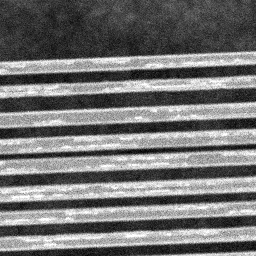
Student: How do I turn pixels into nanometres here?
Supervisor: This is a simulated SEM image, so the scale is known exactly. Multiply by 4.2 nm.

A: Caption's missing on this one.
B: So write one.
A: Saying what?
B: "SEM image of parallel lines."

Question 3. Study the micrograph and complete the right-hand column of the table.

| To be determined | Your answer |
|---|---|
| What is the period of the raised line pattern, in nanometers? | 105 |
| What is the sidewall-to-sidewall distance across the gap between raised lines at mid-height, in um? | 0.0588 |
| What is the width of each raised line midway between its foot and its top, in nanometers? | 49.3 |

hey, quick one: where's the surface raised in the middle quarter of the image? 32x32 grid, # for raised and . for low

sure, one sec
###############################.
#######.........................
................................
................................
...................#############
################################
################...###..........
................................
................................
................................
................................
..............##################
################################
################################
##########......................
................................
................................
............................####
....############################
################################
########################........
................................
................................
........########################
################################
############################....
####............................
................................
................................
...........................#####
...#############################
################################